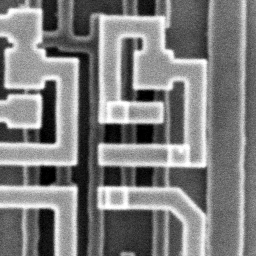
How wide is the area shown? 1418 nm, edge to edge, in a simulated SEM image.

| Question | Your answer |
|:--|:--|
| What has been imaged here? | wiring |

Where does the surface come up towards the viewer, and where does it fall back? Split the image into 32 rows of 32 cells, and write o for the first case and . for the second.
................................
.oooo...........................
ooooo........ooooooo............
ooooo........ooooooo............
ooooo........ooooooo............
.oooo........oo...ooo...........
.ooooo......ooo..oooo...........
.ooooooooo..ooo..oooooooo.......
.ooooooooo..ooo..ooooooooo......
.ooooooooo..ooo..ooooooooo......
.ooooo.ooo...oo..ooooo.ooo......
.......ooo...oo........ooo......
.oooo..ooo..ooo........ooo......
ooooo..ooo..oooooooo...ooo......
ooooo..ooo..oooooooo...ooo......
.oooo..ooo.............ooo......
.......ooo.............ooo......
.......ooo.............ooo......
oooooooooo..oooooooooooooo......
oooooooooo..oooooooooooooo......
ooooooooo....ooooooooooooo......
................................
................................
ooooooooo....ooooooooo..........
oooooooooo..ooooooooooo.........
oooooooooo..oooooooooooo........
.......ooo............ooo.......
.......ooo.............ooo......
.......ooo.............ooo......
.......ooo.............ooo......
.......ooo.............ooo......
.......ooo.............ooo......